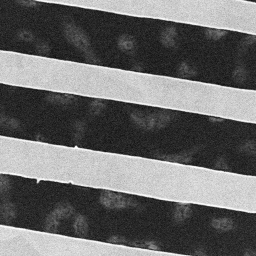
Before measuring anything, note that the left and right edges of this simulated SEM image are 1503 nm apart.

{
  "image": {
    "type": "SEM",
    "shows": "one or a few lines or trenches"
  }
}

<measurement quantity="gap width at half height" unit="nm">315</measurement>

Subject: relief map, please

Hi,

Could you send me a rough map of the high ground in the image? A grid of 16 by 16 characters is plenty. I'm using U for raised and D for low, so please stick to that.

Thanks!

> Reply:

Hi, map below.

DDDDDDUUUUUUUUUU
DDDDDDDDDDDDUUUU
DDDDDDDDDDDDDDDD
UUDDDDDDDDDDDDDD
UUUUUUUUDDDDDDDD
DDUUUUUUUUUUUUUD
DDDDDDDDDUUUUUUU
DDDDDDDDDDDDDDDU
DDDDDDDDDDDDDDDD
UUUUUUDDDDDDDDDD
UUUUUUUUUUUUUDDD
DDDDDUUUUUUUUUUU
DDDDDDDDDDUUUUUU
DDDDDDDDDDDDDDDD
UUDDDDDDDDDDDDDD
UUUUUUUUDDDDDDDD